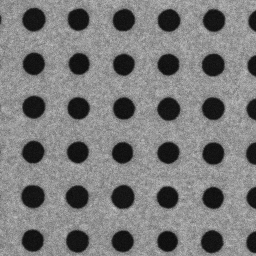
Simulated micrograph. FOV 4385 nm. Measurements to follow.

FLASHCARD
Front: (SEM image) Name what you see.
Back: a regular array of holes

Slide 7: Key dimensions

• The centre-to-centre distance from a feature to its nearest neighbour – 0.752 micrometres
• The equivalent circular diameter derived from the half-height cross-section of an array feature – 22.2 px